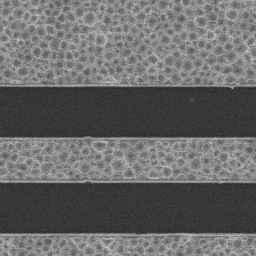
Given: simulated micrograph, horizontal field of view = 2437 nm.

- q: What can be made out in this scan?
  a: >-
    one or a few lines or trenches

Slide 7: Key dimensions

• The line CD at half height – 407 nanometers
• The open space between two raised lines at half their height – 507 nm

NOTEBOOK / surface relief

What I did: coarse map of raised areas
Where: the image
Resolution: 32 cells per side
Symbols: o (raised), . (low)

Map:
oooooooooooooooooooooooooooooooo
oooooooooooooooooooooooooooooooo
oooooooooooooooooooooooooooooooo
oooooooooooooooooooooooooooooooo
oooooooooooooooooooooooooooooooo
oooooooooooooooooooooooooooooooo
oooooooooooooooooooooooooooooooo
oooooooooooooooooooooooooooooooo
oooooooooooooooooooooooooooooooo
oooooooooooooooooooooooooooooooo
oooooooooooooooooooooooooooooooo
................................
................................
................................
................................
................................
................................
oooooooooooooooooooooooooooooooo
oooooooooooooooooooooooooooooooo
oooooooooooooooooooooooooooooooo
oooooooooooooooooooooooooooooooo
oooooooooooooooooooooooooooooooo
oooooooooooooooooooooooooooooooo
................................
................................
................................
................................
................................
................................
oooooooooooooooooooooooooooooooo
oooooooooooooooooooooooooooooooo
oooooooooooooooooooooooooooooooo